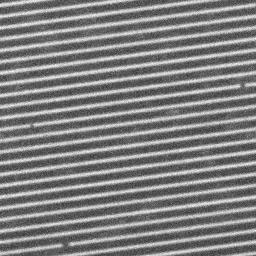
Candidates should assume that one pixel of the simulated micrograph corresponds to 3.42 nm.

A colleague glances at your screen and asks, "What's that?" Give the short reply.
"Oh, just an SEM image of parallel lines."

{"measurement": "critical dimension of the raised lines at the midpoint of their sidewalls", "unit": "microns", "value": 0.0063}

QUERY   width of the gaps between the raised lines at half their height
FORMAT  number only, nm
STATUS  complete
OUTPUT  32.2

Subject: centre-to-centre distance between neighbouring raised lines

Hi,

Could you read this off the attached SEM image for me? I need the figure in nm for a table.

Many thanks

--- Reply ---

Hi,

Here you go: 38.3